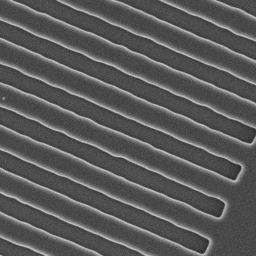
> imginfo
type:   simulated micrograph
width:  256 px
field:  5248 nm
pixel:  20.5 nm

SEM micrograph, groups of lines, slits or small figures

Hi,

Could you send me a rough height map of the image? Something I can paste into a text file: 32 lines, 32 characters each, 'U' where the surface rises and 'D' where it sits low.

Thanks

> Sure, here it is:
UUDDDDDDUUUUUUUDDDDDDUUUUUUUDDDD
UUUUUDDDDDUUUUUUUUDDDDDUUUUUUUUD
UUUUUUUDDDDDDUUUUUUUDDDDDDUUUUUU
DDDUUUUUUUDDDDDUUUUUUUDDDDDDUUUU
DDDDDUUUUUUUDDDDDDUUUUUUUDDDDDUU
UUDDDDDUUUUUUUDDDDDDUUUUUUUDDDDD
UUUUDDDDDDUUUUUUUDDDDDUUUUUUUDDD
UUUUUUDDDDDDUUUUUUUDDDDDDUUUUUUU
DDUUUUUUUDDDDDDUUUUUUDDDDDDUUUUU
DDDDUUUUUUUDDDDDDUUUUUUUDDDDDUUU
DDDDDDUUUUUUUDDDDDDUUUUUUUDDDDDD
UUUDDDDDUUUUUUUUDDDDDUUUUUUUUDDD
UUUUUDDDDDDUUUUUUUDDDDDDUUUUUUUD
DUUUUUUUDDDDDUUUUUUUDDDDDDUUUUUU
DDDUUUUUUUDDDDDDUUUUUUUDDDDDUUUU
DDDDDUUUUUUUDDDDDDUUUUUUUDDDDDDU
UUDDDDDDUUUUUUUDDDDDDUUUUUUDDDDD
UUUUDDDDDDUUUUUUUDDDDDDUUUUUUUDD
UUUUUUUDDDDDUUUUUUUDDDDDDUUUUUUU
DDUUUUUUUDDDDDDUUUUUUUDDDDDUUUUU
DDDDUUUUUUUDDDDDDUUUUUUUDDDDDDUU
UDDDDDUUUUUUUUDDDDDUUUUUUUUDDDUU
UUUDDDDDDUUUUUUUDDDDDDUUUUUUUUUU
UUUUUUDDDDDUUUUUUUDDDDDDUUUUUUUU
DUUUUUUUDDDDDDUUUUUUUDDDDDUUUUUU
DDDUUUUUUUDDDDDDUUUUUUUDDDDDUUUU
DDDDDDUUUUUUUDDDDDUUUUUUUDDDUUUU
UUDDDDDDUUUUUUUDDDDDDUUUUUUUUUUU
UUUUUDDDDDUUUUUUUDDDDDDUUUUUUUUU
UUUUUUUDDDDDDUUUUUUUDDDDDUUUUUUU
DDUUUUUUUDDDDDDUUUUUUUDDDDUUUUUU
DDDDDUUUUUUUDDDDDUUUUUUUDDUUUUUU